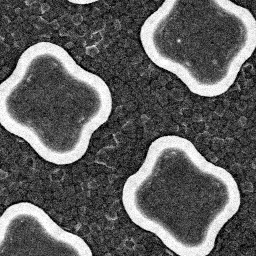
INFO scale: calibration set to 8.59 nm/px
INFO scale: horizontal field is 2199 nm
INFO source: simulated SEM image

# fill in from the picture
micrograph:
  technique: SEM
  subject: raised bodies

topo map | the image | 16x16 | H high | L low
LLLLLLLLLLHHHHHL
LLLLLLLLLHHHHHHH
LLLLLLLLLHHHHHHH
LLHHLLLLLLHHHHHL
LHHHHLLLLLLHHHHL
HHHHHHLLLLLLHHLL
HHHHHHHLLLLLLLLL
HHHHHHLLLLLLLLLL
LLHHHLLLLLLLLLLL
LLLHHLLLLLHHLLLL
LLLLLLLLLHHHHLLL
LLLLLLLLHHHHHHLL
LLLLLLLLHHHHHHHL
LHHLLLLLHHHHHHLL
HHHHLLLLLLHHHLLL
HHHHHLLLLLLHHLLL